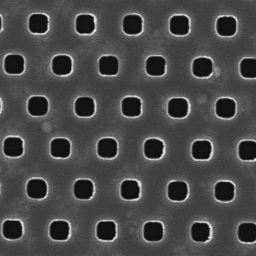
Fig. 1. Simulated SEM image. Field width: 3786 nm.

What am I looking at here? a regular array of holes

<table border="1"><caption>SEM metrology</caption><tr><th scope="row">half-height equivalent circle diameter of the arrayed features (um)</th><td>0.305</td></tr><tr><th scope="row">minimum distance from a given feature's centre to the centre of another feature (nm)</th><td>693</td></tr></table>